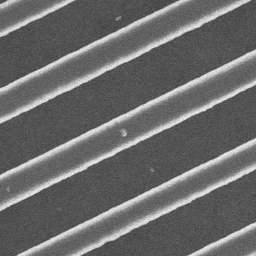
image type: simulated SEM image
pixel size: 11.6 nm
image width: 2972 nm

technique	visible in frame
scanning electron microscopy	lines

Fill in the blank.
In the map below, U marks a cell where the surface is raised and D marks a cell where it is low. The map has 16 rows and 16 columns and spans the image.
UUUUDDDDDDUUUUUD
UUDDDDDDUUUUUDDD
DDDDDDUUUUUDDDDD
DDDDUUUUUDDDDDDU
DDUUUUUDDDDDDUUU
UUUUUDDDDDDUUUUU
UUUDDDDDDUUUUUDD
DDDDDDDUUUUDDDDD
DDDDDUUUUDDDDDDD
DDDUUUUDDDDDDDUU
DUUUUDDDDDDDUUUU
UUUDDDDDDDUUUUDD
UDDDDDDDUUUUDDDD
DDDDDDUUUUDDDDDD
DDDDUUUUDDDDDDDU
DDUUUUDDDDDDDUUU